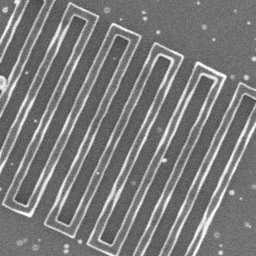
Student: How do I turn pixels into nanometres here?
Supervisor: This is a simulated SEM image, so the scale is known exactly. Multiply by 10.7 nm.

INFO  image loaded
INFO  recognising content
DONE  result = groups of lines, slits or small figures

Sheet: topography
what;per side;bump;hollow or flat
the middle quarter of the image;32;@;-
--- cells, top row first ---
@@@----@@-----@@----@@-----@@---
@@----@@@----@@-----@@----@@----
@@----@@@----@@----@@-----@@----
@-----@@----@@-----@@----@@----@
@----@@@----@@----@@@----@@----@
-----@@----@@@----@@----@@-----@
----@@@----@@----@@@----@@----@@
----@@----@@@----@@----@@-----@@
---@@@----@@----@@@----@@-----@-
---@@----@@@----@@----@@@----@@-
--@@@----@@----@@@----@@----@@--
--@@-----@@----@@----@@@----@@--
--@@----@@----@@@----@@----@@@--
-@@-----@@----@@-----@@----@@---
-@@----@@----@@@----@@-----@@---
@@----@@@----@@-----@@----@@----
@@----@@----@@@----@@-----@@----
@-----@@----@@-----@@----@@----@
@----@@-----@@----@@-----@@----@
@----@@----@@-----@@----@@-----@
----@@@----@@----@@-----@@----@@
----@@----@@-----@@----@@-----@@
---@@@----@@----@@-----@@----@@-
---@@----@@@----@@----@@@----@@-
---@@----@@----@@@----@@----@@@-
--@@----@@@----@@----@@@----@@--
-@@@----@@-----@@----@@----@@@--
-@@----@@@----@@----@@@----@@---
@@@----@@----@@@----@@----@@@---
@@----@@@----@@----@@@----@@----
@@----@@-----@@----@@----@@@----
@-----@@----@@----@@@----@@----@